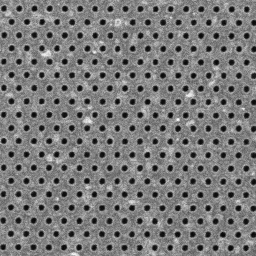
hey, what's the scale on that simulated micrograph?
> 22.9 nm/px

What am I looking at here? a regular array of holes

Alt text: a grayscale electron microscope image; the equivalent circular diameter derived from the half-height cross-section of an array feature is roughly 0.148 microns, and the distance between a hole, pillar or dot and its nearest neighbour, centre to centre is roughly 341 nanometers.